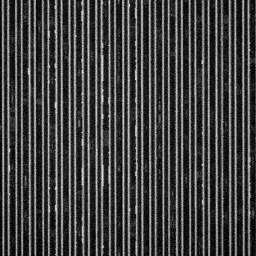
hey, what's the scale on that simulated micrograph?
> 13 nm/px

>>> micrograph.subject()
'parallel lines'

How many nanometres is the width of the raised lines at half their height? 73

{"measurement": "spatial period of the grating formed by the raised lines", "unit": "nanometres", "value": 173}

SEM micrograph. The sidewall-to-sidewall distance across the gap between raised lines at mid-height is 95.7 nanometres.